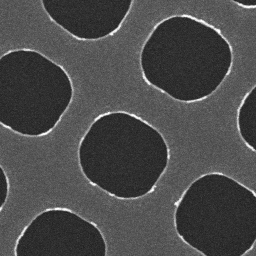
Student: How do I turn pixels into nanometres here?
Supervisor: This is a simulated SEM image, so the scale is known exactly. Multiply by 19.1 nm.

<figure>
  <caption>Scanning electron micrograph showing holes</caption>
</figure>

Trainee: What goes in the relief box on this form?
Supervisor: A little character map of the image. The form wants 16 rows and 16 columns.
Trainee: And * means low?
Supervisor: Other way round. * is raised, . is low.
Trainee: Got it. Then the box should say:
***.....********
****...***...***
*********.....**
...******.....**
....*****.....**
....******...***
....***********.
....**...******.
*****.....*****.
*****.....******
*****.....******
******....**...*
***********.....
**...******.....
**....*****.....
*......*****....